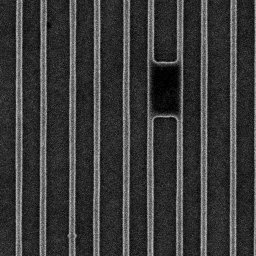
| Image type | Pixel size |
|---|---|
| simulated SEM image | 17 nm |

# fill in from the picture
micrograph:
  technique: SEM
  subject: parallel lines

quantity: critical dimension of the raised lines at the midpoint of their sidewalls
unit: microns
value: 0.0869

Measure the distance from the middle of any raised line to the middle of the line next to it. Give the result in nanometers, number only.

454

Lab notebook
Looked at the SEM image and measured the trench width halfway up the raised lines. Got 329 nm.